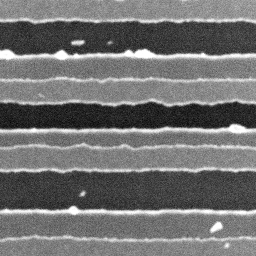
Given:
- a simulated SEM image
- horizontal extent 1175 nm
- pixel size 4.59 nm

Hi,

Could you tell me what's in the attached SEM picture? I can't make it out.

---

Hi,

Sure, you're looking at lines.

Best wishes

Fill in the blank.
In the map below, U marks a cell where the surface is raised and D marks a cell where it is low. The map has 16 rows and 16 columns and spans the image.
UUUUUUUUUUUUUUUU
DDDDDDDDDDDDDDDD
DDDDDDDDDDDDDDDD
UUUUUUUUUUUUUDUU
UUUUUUUUUUUUUUUU
UUUUUUUUUUUUUUUU
DDDDDDDDDDUDDDDD
DDDDDDDDDDDDDDDD
UUUUUUUUUUUUUUUU
UUUUUUUUUUUUUUUU
UUUUUUUUUUUUUUUU
DDDDDDDDDDDDDDDD
DDDDDDDDDDDDDDDD
UUUUUUUUUUUUUUUU
UUUUUUUUUUUUUUUU
UUUUUUUUUUUUUUUU